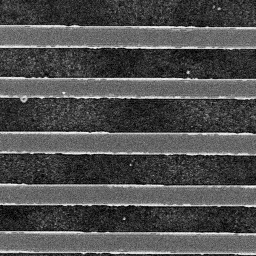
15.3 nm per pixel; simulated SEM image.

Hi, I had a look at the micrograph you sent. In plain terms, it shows lines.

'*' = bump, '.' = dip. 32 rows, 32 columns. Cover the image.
................................
................................
................................
************************........
********************************
********************************
................................
................................
................................
................................
********************************
********************************
................................
................................
................................
................................
................................
********************************
********************************
................................
................................
................................
................................
********************************
********************************
********************************
................................
................................
................................
********************************
********************************
********************************